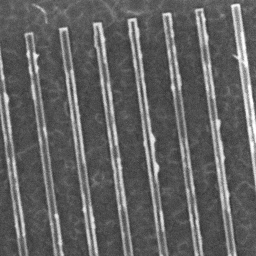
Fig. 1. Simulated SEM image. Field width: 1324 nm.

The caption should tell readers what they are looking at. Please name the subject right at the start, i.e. parallel lines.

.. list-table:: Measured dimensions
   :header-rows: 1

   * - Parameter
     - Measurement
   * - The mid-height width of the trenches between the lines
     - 26.5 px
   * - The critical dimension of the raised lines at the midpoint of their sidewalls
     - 39.6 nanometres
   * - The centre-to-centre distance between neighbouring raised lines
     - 179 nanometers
